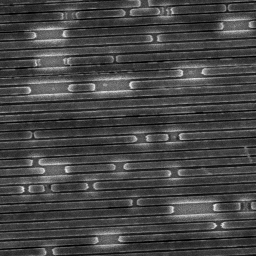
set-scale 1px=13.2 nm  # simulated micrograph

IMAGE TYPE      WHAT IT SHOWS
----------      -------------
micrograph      parallel lines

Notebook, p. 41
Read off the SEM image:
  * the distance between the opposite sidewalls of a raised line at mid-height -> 94.1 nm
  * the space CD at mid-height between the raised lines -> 24.8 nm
